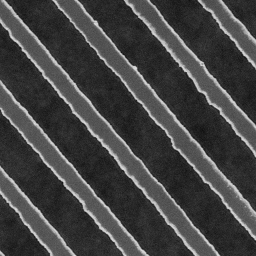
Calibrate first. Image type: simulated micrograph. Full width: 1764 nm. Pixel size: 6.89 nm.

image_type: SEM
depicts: lines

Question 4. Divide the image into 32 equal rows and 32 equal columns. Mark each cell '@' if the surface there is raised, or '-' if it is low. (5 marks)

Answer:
@------@@@------@@@------@@@----
@@------@@@------@@@------@@@---
@@@------@@@------@@@------@@@--
-@@@------@@@------@@-------@@@-
-@@@------@@@------@@@-------@@-
--@@@------@@@------@@@------@@@
---@@@------@@@------@@@------@@
----@@@------@@@------@@@------@
-----@@@------@@@------@@@------
-----@@@@------@@@------@@@-----
------@@@-------@@------@@@-----
@------@@@------@@@------@@@----
@@------@@@------@@@------@@@---
@@@------@@@------@@@------@@@--
-@@@------@@@------@@@------@@@-
--@@@------@@@------@@@------@@@
--@@@------@@@-------@@@-----@@@
---@@@------@@@------@@@------@@
----@@@------@@@------@@@------@
-----@@@------@@@------@@@------
------@@@------@@@------@@@-----
@------@@@------@@@------@@@----
@@------@@-------@@@-----@@@----
@@------@@@------@@@@-----@@@---
@@@------@@@------@@@------@@@--
-@@@------@@@------@@@------@@@-
--@@@------@@@------@@@------@@@
---@@@------@@@------@@@------@@
----@@@------@@@------@@@------@
----@@@@------@@------@@@------@
-----@@@------@@@------@@@------
------@@@------@@@------@@@-----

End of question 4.